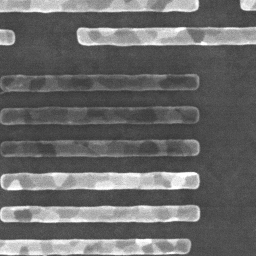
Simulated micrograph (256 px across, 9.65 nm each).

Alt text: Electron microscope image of wiring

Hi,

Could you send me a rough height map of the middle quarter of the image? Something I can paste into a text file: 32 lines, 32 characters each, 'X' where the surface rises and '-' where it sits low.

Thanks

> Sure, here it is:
--------------------------------
--------------------------------
--------------------------------
XXXXXXXXXXXXXXXXXXXXXXXXXXXXXXXX
XXXXXXXXXXXXXXXXXXXXXXXXXXXXXXXX
XXXXXXXXXXXXXXXXXXXXXXXXXXXXXXXX
XXXXXXXX---XXXX-XXXXX-----------
--------------------------------
--------------------------------
--------------------------------
--------------------------------
XXXXXXXXXXXXXXXXXXXXXXXXXXXXXXXX
XXXXXXXXXXXXXXXXXXXXXXXXXXXXXXXX
XXXXXXXXXXXXXXXXXXXXXXXXXXXXXXXX
XXXXXXXXXXXXXXXXXXXXXXXXXXXXXXXX
--------------------------------
--------------------------------
--------------------------------
--------------------------------
XXXXXXXXXXXXXXXXXXXXXXXXXXXXXXXX
XXXXXXXXXXXXXXXXXXXXXXXXXXXXXXXX
XXXXXXXXXXXXXXXXXXXXXXXXXXXXXXXX
XXXXXXXXXXXXXXXXXXXXXXXXXXXXXXXX
--------------------------------
--------------------------------
--------------------------------
--------------------------------
XXXXXXXXXXXXXX--XXXXXXXXXXXXXXXX
XXXXXXXXXXXXXXXXXXXXXXXXXXXXXXXX
XXXXXXXXXXXXXXXXXXXXXXXXXXXXXXXX
XXXXXXXXXXXXXXXXXXXXXXXXXXXXXXXX
--------------------------------